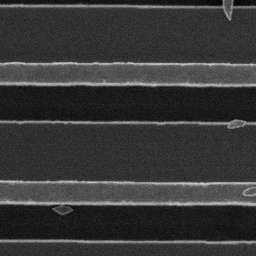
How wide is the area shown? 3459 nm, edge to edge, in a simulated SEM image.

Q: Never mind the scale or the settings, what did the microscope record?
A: lines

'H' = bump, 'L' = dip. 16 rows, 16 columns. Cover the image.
HHHHHHHHHHHHHHHH
HHHHHHHHHHHHHHHH
HHHHHHHHHHHHHHHH
HHHHHHHHHHHHHHHH
HHHHHHHHHHHHHHHH
LLLLLLLLLLLLLLLL
LLLLLLLLLLLLLLLL
LLLLLLLLLLLLLLLL
HHHHHHHHHHHHHHHH
HHHHHHHHHHHHHHHH
HHHHHHHHHHHHHHHH
HHHHHHHHHHHHHHHH
HHHHHHHHHHHHHHHH
LLLLLLLLLLLLLLLL
LLLLLLLLLLLLLLLL
HHHHHHHHHHHHHHHH